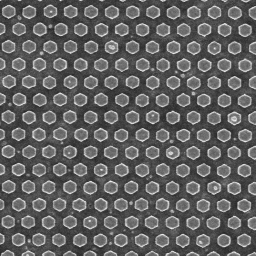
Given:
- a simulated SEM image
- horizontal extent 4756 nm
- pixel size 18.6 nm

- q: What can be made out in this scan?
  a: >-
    a regular array of raised bodies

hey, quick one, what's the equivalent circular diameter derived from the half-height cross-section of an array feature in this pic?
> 239 nanometers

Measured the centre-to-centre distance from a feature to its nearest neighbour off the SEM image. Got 371 nm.